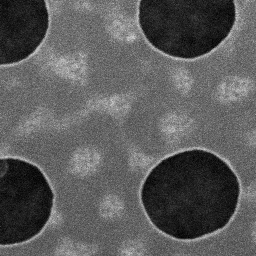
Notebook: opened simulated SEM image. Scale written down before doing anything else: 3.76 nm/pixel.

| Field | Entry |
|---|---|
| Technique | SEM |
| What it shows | holes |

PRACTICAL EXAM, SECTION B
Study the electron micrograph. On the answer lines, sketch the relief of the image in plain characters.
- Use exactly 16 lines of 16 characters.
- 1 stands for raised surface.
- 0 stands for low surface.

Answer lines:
0001111110000001
0001111110000001
0001111110000011
0011111111101111
1111111111111111
1111111111111111
1111111111111111
1111111111111111
1111111111111111
1111111111100111
0011111111000011
0001111110000001
0001111110000001
0001111110000011
0011111111000111
1111111111111111